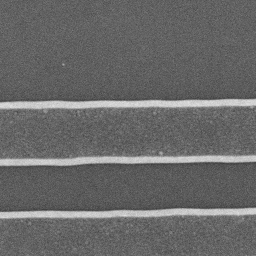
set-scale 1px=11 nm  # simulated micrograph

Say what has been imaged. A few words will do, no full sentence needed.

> wiring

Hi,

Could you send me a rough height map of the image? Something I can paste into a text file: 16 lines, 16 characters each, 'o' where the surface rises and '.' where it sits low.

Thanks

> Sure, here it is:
................
................
................
................
................
................
.........ooooooo
oooooooooooooooo
oooooooooooooooo
oooooooooooooooo
................
................
................
oooooooooooooooo
oooooooooooooooo
oooooooooooooooo